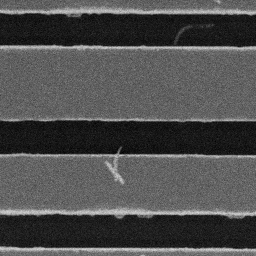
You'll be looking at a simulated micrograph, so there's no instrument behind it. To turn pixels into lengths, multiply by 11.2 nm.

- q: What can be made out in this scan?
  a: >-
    lines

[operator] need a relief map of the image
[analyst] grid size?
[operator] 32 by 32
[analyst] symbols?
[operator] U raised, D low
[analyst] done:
UUUUUUUUUUUUUUUUUUUUUUUUUUUUUUUU
UUUUUUUUUUUUUUUUUUUUUUUUUUUUUUUU
DDDDDDDDDDDDDDDDDDDDDDDDDDDDDDDD
DDDDDDDDDDDDDDDDDDDDDDDDDDDDDDDD
DDDDDDDDDDDDDDDDDDDDDDDDDDDDDDDD
DDDDDDDDDDDDDDDDDDDDDDDDDDDDDDDD
UUUUUUUUUUUUUUUUUUUUUUUUUUUUUUUU
UUUUUUUUUUUUUUUUUUUUUUUUUUUUUUUU
UUUUUUUUUUUUUUUUUUUUUUUUUUUUUUUU
UUUUUUUUUUUUUUUUUUUUUUUUUUUUUUUU
UUUUUUUUUUUUUUUUUUUUUUUUUUUUUUUU
UUUUUUUUUUUUUUUUUUUUUUUUUUUUUUUU
UUUUUUUUUUUUUUUUUUUUUUUUUUUUUUUU
UUUUUUUUUUUUUUUUUUUUUUUUUUUUUUUU
UUUUUUUUUUUUUUUUUUUUUUUUUUUUUUUU
DDDDDDDDDDDDDDDDDDDDDDDDDDDDDDDD
DDDDDDDDDDDDDDDDDDDDDDDDDDDDDDDD
DDDDDDDDDDDDDDDDDDDDDDDDDDDDDDDD
DDDDDDDDDDDDDDDDDDDDDDDDDDDDDDDD
UUUUUUUUUUUUUUUUUUUUUUUUUUUUUUUU
UUUUUUUUUUUUUUUUUUUUUUUUUUUUUUUU
UUUUUUUUUUUUUUUUUUUUUUUUUUUUUUUU
UUUUUUUUUUUUUUUUUUUUUUUUUUUUUUUU
UUUUUUUUUUUUUUUUUUUUUUUUUUUUUUUU
UUUUUUUUUUUUUUUUUUUUUUUUUUUUUUUU
UUUUUUUUUUUUUUUUUUUUUUUUUUUUUUUU
UUUUUUUUUUUUUUUUUUUUUUUUUUUUUUUU
DDDDDDDDDDDDDDDDDDDDDDDDDDDDDDDD
DDDDDDDDDDDDDDDDDDDDDDDDDDDDDDDD
DDDDDDDDDDDDDDDDDDDDDDDDDDDDDDDD
DDDDDDDDDDDDDDDDDDDDDDDDDDDDDDDD
UUUUUUUUUUUUUUUUUUUUUUUUUUUUUUUU